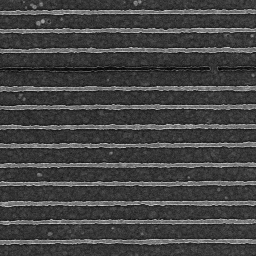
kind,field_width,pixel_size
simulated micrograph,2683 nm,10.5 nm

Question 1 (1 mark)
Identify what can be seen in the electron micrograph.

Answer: parallel lines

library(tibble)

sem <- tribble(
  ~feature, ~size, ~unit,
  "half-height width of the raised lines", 40.6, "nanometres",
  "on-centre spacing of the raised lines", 200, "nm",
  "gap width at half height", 158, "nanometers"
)